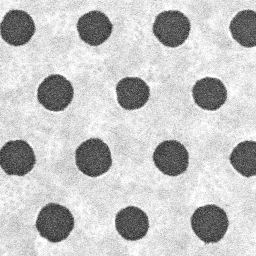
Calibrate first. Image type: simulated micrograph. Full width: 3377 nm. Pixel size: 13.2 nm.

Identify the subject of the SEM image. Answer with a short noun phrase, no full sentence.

a regular array of holes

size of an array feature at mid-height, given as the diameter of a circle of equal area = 496 nanometers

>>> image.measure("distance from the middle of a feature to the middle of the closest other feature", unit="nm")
994